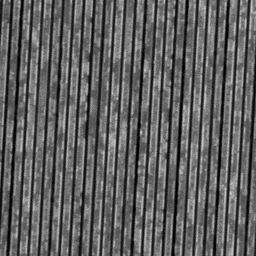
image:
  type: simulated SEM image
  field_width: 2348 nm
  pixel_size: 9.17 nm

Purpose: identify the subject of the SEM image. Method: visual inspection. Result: parallel lines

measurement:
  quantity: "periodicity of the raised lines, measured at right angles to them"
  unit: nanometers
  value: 94.4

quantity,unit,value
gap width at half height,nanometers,35.5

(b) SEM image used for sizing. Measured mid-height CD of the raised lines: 61.8 nm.